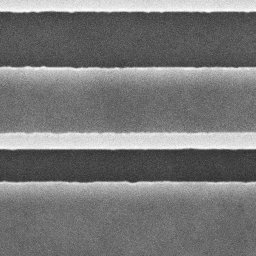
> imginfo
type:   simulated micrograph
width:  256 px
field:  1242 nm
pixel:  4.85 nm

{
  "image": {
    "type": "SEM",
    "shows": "lines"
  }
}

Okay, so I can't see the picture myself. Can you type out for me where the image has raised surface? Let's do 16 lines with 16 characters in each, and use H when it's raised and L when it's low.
HHHHHHHHHHHHHHHH
LLLLLLLLLLLLLLLL
LLLLLLLLLLLLLLLL
LLLLLLLLLLLLLLLL
HHHHHHHHHHHHHHHH
HHHHHHHHHHHHHHHH
HHHHHHHHHHHHHHHH
HHHHHHHHHHHHHHHH
HHHHHHHHHHHHHHHH
LLLLLLLLLLLLLLLL
LLLLLLLLLLLLLLLL
HHHHHHHHHHHHHHHH
HHHHHHHHHHHHHHHH
HHHHHHHHHHHHHHHH
HHHHHHHHHHHHHHHH
HHHHHHHHHHHHHHHH